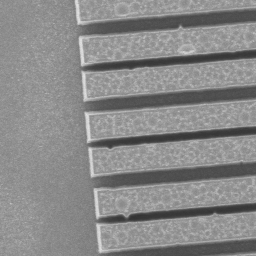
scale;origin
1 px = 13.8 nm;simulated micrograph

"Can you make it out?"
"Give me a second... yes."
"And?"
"parallel lines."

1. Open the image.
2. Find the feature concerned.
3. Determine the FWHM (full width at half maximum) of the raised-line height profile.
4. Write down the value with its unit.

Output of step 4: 390 nm